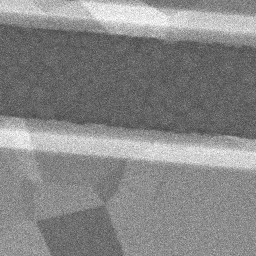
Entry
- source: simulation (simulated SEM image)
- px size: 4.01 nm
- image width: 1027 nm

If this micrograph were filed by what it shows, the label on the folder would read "one or a few lines or trenches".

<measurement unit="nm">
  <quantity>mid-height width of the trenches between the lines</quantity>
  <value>528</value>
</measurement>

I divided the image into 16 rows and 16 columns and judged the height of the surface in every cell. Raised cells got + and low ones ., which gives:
..++++++++++++++
..............++
................
................
................
................
................
................
................
+++++++++++.....
++++++++++++++++
++++++++++++++++
++++++++++++++++
++++++++++++++++
++++++++++++++++
++++++++++++++++